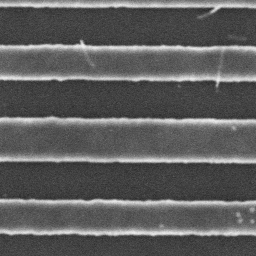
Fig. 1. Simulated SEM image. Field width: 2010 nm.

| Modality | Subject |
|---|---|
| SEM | lines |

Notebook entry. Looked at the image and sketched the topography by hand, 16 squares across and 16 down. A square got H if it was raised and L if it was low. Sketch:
LLLLLLLLLLLLLLLL
LLLLLLLLLLLLLLLL
LLLLLLLLLLLLLLLL
HHHHHHHHHHHHHHHH
HHHHHHHHHHHHHHHH
LLLLLLLLLLLLLLLL
LLLLLLLLLLLLLLLL
HHHHHHHHHHHHHHLL
HHHHHHHHHHHHHHHH
HHHHHHHHHHHHHHHH
LLLLLLLLLLLLLLLL
LLLLLLLLLLLLLLLL
HHHLLLHLLLLLLLLL
HHHHHHHHHHHHHHHH
HHHHHHHHHHHHHHHH
LLLLLLLLLLLLLLLL